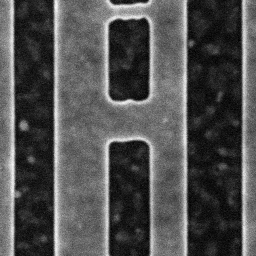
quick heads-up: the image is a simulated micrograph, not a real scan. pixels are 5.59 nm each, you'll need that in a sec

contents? one or a few lines or trenches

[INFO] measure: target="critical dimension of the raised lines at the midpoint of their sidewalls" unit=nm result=260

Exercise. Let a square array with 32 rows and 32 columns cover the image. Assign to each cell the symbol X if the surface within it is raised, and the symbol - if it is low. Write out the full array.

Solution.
XX-----XXXXXXX----XXXXX-------XX
XX-----XXXXXXXXXXXXXXXX-------XX
XX-----XXXXXXX-----XXXX-------XX
XX-----XXXXXX------XXXX-------XX
XX-----XXXXXX------XXXX-------XX
XX-----XXXXXX------XXXX-------XX
XX-----XXXXXX------XXXX--------X
XX-----XXXXXX------XXXX--------X
XX-----XXXXXX------XXXX--------X
XX-----XXXXXX------XXXX--------X
XX-----XXXXXX------XXXX--------X
XX-----XXXXXX------XXXX--------X
XX-----XXXXXXX----XXXXX-------XX
XX-----XXXXXXXXXXXXXXXX-------XX
XX-----XXXXXXXXXXXXXXXX-------XX
XX-----XXXXXXXXXXXXXXXX-------XX
XX-----XXXXXXXXXXXXXXXX-------XX
XX-----XXXXXXXXX--XXXXX-------XX
XX-----XXXXXX------XXXX-------XX
XX-----XXXXXX------XXXX-------XX
XX-----XXXXXX------XXXX-------XX
XX-----XXXXXX------XXXX-------XX
XX-----XXXXXX------XXXX-------XX
XX-----XXXXXX------XXXX-------XX
XX-----XXXXXX------XXXX-------XX
XX-----XXXXXX------XXXX-------XX
XX-----XXXXXX------XXXX-------XX
XX-----XXXXXX------XXXX-------XX
XX-----XXXXXX------XXXX-------XX
XX-----XXXXXX------XXXX-------XX
XX-----XXXXXX------XXXX-------XX
XX-----XXXXXX------XXXX-------XX